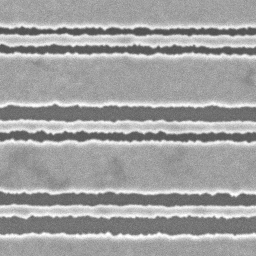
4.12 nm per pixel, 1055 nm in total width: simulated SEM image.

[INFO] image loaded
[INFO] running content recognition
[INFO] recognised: lines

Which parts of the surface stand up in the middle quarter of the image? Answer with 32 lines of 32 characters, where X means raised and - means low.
XXXXXXXXXXXXXXXXXXXXXXXXXXXXXXXX
XXXXXXXXXXXXXXXXXXXXXXXXXXXXXXXX
XXXXXXXXXXXXXXXXXXXXXXXXXXXXXXXX
XXXXXXXXXXXXXXXXXXXXXXXXXXXXXXXX
XXXXXXXXXXXXXXXXXXXXXXXXXXXXXXXX
XXXXXXXXXXXXXXXXXXXXXXXXXXXXXXXX
XXXXXXXXXXXXXXXXXXXXXXXXXXXXXXXX
XXXXXXXXXXXXXXXXXXXXXXXXXXXXXXXX
XXXXXXXXXXXXXXXXXXXXXXXXXXXXXXXX
XXXXXXXXXXXXXXXXXXXXXXXXXXXXXXXX
XX--XXXXXX----X-XX--XXXXXXXXXXXX
--------------------------------
--------------------------------
--------------------------------
--XXXXXXXXXX-XXXXXX-XXXXXX-XXXXX
XXXXXXXXXXXXXXXXXXXXXXXXXXXXXXXX
XXXXXXXXXXXXXXXXXXXXXXXXXXXXXXXX
--------------------------------
--------------------------------
XXXX-XXXXXXXXXXXXXXXXXXXXXXXX--X
XXXXXXXXXXXXXXXXXXXXXXXXXXXXXXXX
XXXXXXXXXXXXXXXXXXXXXXXXXXXXXXXX
XXXXXXXXXXXXXXXXXXXXXXXXXXXXXXXX
XXXXXXXXXXXXXXXXXXXXXXXXXXXXXXXX
XXXXXXXXXXXXXXXXXXXXXXXXXXXXXXXX
XXXXXXXXXXXXXXXXXXXXXXXXXXXXXXXX
XXXXXXXXXXXXXXXXXXXXXXXXXXXXXXXX
XXXXXXXXXXXXXXXXXXXXXXXXXXXXXXXX
XXXXXXXXXXXXXXXXXXXXXXXXXXXXXXXX
XXXXXXXXXXXXXXXXXXXXXXXXXXXXXXXX
XXXXXXXXXXXXXXXXXXXXXXXXXXXXXXXX
XXXXXXXXXXXXXXXXXXXXXXXXXXXXXXXX